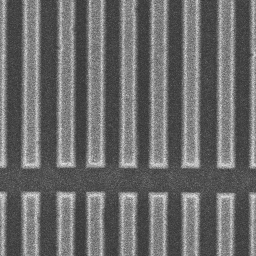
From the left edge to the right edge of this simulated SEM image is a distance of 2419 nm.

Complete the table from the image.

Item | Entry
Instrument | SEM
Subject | parallel lines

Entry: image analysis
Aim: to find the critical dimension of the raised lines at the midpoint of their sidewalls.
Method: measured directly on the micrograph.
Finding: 148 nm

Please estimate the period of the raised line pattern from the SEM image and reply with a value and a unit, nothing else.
0.307 um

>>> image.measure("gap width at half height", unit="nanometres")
156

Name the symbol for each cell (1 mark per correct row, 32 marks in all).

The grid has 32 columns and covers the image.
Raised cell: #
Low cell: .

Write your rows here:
#..##..##..##..##..##..##..##..#
#..##..##..##..##..##..##..##..#
#..##..##..##..##..##..##..##..#
#..##..##..##..##..##..##..##..#
#..##..##..##..##..##..##..##..#
#..##..##..##..##..##..##..##..#
#..##..##..##..##..##..##..##..#
#..##..##..##..##..##..##..##..#
#..##..##..##..##..##..##..##..#
#..##..##..##..##..##..##..##..#
#..##..##..##..##..##..##..##..#
#..##..##..##..##..##..##..##..#
#..##..##..##..##..##..##..##..#
#..##..##..##..##..##..##..##..#
#..##..##..##..##..##..##..##..#
#..##..##..##..##..##..##..##..#
#..##..##..##..##..##..##..##..#
#..##..##..##..##..##..##..##..#
#..##..##..##..##..##..##..##..#
#..##..##..##..##..##..##..##..#
...##..##..##..##..##..##..##..#
................................
................................
................................
#..##..##..##..##..##..##..##..#
#..##..##..##..##..##..##..##..#
#..##..##..##..##..##..##..##..#
#..##..##..##..##..##..##..##..#
#..##..##..##..##..##..##..##..#
#..##..##..##..##..##..##..##..#
#..##..##..##..##..##..##..##..#
#..##..##..##..##..##..##..##..#